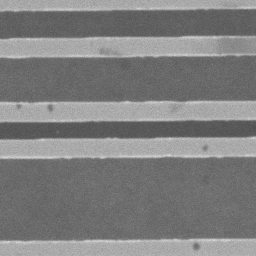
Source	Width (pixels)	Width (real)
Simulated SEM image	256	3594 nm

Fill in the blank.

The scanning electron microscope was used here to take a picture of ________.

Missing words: lines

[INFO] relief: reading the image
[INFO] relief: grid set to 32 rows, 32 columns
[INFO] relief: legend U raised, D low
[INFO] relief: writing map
UUUUUUUUUUUUUUUUUUUUUUUUUUUUUUUU
DDDDDDDDDDDDDDDDDDDDDDDDDDDDDDDD
DDDDDDDDDDDDDDDDDDDDDDDDDDDDDDDD
DDDDDDDDDDDDDDDDDDDDDDDDDDDDDDDD
DDDDDDDDDDDDDDDDDDDDDDDDDDDDDDDD
UUUUUUUUUUUUUUUUUUUUUUUUUUUUUUUU
UUUUUUUUUUUUUUUUUUUUUUUUUUUUUUUU
DDDDDDDDDDDDDDDDDDDDDDDDDDDDDDDD
DDDDDDDDDDDDDDDDDDDDDDDDDDDDDDDD
DDDDDDDDDDDDDDDDDDDDDDDDDDDDDDDD
DDDDDDDDDDDDDDDDDDDDDDDDDDDDDDDD
DDDDDDDDDDDDDDDDDDDDDDDDDDDDDDDD
DDDDDDDDDDDDDDDDDDDDDDDDDDDDDDDD
UUUUUUUUUUUUUUUUUUUUUUUUUUUUUUUU
UUUUUUUUUUUUUUUUUUUUUUUUUUUUUUUU
DDDDDDDDDDDDDDDDDDDDDDDDDDDDDDDD
DDDDDDDDDDDDDDDDDDDDDDDDDDDDDDDD
DDDDUUUUUUUUUUUUUUUUUUUUUUUUUUUU
UUUUUUUUUUUUUUUUUUUUUUUUUUUUUUUU
UUUUUUUUUUUUUUUUUUUUUDUUUUDDDDDD
DDDDDDDDDDDDDDDDDDDDDDDDDDDDDDDD
DDDDDDDDDDDDDDDDDDDDDDDDDDDDDDDD
DDDDDDDDDDDDDDDDDDDDDDDDDDDDDDDD
DDDDDDDDDDDDDDDDDDDDDDDDDDDDDDDD
DDDDDDDDDDDDDDDDDDDDDDDDDDDDDDDD
DDDDDDDDDDDDDDDDDDDDDDDDDDDDDDDD
DDDDDDDDDDDDDDDDDDDDDDDDDDDDDDDD
DDDDDDDDDDDDDDDDDDDDDDDDDDDDDDDD
DDDDDDDDDDDDDDDDDDDDDDDDDDDDDDDD
DDDDDDDDDDDDDDDDDDDDDDDDDDDDDDDD
UUUUUUUUUUUUUUUUUUUUUUUUUUUUUUUU
UUUUUUUUUUUUUUUUUUUUUUUUUUUUUUUU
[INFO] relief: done